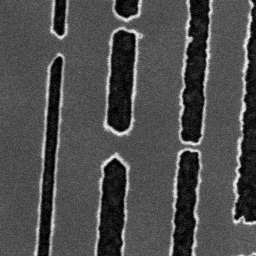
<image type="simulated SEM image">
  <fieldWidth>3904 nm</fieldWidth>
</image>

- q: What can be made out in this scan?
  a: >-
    one or a few lines or trenches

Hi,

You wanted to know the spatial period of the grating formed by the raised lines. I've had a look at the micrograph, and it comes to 1070 nanometers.